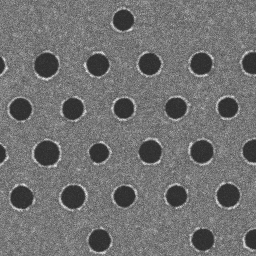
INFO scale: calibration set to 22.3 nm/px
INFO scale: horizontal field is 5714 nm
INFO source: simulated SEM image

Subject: a regular array of holes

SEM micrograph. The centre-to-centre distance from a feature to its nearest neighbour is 1140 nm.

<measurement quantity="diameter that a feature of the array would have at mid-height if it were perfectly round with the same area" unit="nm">514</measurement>